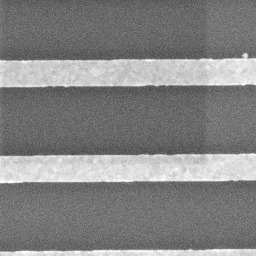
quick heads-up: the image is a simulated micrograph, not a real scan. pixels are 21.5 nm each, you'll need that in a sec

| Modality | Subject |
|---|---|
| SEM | lines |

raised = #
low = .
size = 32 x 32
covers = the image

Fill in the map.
................................
................................
................................
................................
................................
................................
................................
.........................##.####
################################
################################
##############################..
................................
................................
................................
................................
................................
................................
................................
................................
..................###.##########
################################
################################
#############################...
................................
................................
................................
................................
................................
................................
................................
................................
..##############################